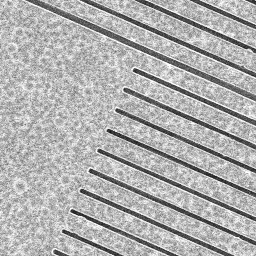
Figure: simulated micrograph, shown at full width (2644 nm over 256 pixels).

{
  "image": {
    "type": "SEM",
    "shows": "parallel lines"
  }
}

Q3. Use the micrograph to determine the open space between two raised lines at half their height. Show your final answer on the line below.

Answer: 52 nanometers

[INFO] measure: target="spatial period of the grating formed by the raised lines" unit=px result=22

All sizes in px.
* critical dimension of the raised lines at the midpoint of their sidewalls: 16.9